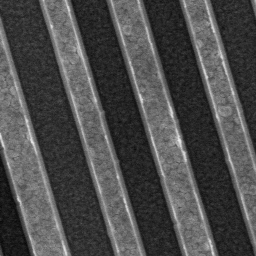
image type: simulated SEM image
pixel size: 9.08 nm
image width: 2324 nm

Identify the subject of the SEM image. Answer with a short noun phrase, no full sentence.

one or a few lines or trenches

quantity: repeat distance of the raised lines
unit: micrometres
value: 0.625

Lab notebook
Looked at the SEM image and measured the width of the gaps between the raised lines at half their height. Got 357 nanometres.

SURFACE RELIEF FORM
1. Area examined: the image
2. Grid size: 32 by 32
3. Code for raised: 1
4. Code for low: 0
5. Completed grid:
00000111100000111100000111000000
00000011100000111100000111000000
00000011100000111100000111100000
00000011110000011110000011100000
10000011110000011110000011100000
10000001110000011110000011110000
10000001110000001110000011110000
10000001111000001111000001110000
11000000111000001111000001110000
11000000111000001111000001111000
11000000111100000111100000111000
11000000011100000111100000111000
11100000011100000111100000111100
11100000011100000011100000011100
11100000011110000011110000011100
11110000001110000011110000011110
11110000001110000001110000011110
11110000001111000001111000001110
11111000000111000001111000001110
11111000000111000001111000001111
01111000000111100000111100000111
01111100000111100000111100000111
01111100000011100000111100000111
00111100000011100000011100000011
00111100000011110000011110000011
00111110000001110000011110000011
00011110000001110000011110000011
00011110000001111000001111000001
00011111000000111000001111000001
00011111000000111000001111000001
00001111000000111100000111100000
00001111100000011100000111100000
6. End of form